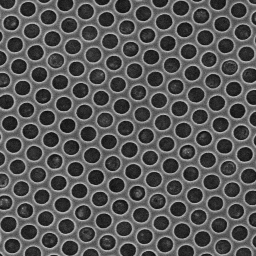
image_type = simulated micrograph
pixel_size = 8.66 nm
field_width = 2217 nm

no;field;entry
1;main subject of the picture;a regular array of holes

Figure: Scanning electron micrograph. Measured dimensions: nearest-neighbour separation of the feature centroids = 187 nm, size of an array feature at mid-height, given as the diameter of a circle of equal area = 135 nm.